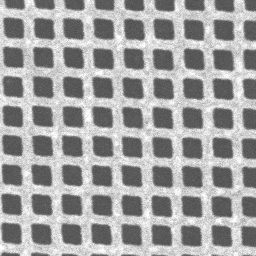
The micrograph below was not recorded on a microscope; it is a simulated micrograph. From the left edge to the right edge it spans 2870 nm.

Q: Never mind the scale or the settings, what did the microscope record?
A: a regular array of holes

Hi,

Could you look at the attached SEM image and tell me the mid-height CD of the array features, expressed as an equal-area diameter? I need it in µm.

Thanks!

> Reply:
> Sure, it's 0.258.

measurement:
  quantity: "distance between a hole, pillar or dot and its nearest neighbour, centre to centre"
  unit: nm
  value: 328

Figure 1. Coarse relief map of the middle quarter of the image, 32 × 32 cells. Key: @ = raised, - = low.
-----@@------@@-----@@-----@@@--
@@@@@@@@@@@@@@@@@@-@@@@----@@@@@
@@@@@@@@@@@@@@@@@@@@@@@@@@@@@@@@
----@@@----@@@@----@@@@---@@@@-@
-----@@-----@@------@@-----@@@--
-----@@-----@@@-----@@-----@@@--
-----@@------@@-----@@------@@--
-----@@-----@@@-----@@------@@--
@----@@@----@@@@----@@@-----@@--
@@@@@@@@@@@@@@@@@@@@@@@@@@@@@@@@
--@@@@@@--@@@@@@@@@@@@@@@@@@@@@@
-----@@-----@@@----@@@-----@@---
-----@@-----@@@-----@@-----@@---
-----@@-----@@@-----@@-----@@@--
-----@@-----@@@-----@@-----@@@--
@----@@@----@@@-----@@-----@@@--
@@@@@@@@@@@@@@@@@@@@@@@@@@@@@@@@
@@@@@@@@@@@@@@@@@@@@@@@@@@@@@@@@
----@@@-----@@-----@@@----@@@@--
-----@@-----@@------@@-----@@---
-----@@-----@@------@@-----@@---
-----@@-----@@------@@-----@@---
-----@@------@@-----@@-----@@---
@@@@@@@@@@@-@@@@@--@@@@----@@@@-
@@@@@@@@@@@@@@@@@@@@@@@@@@@@@@@@
----@@@----@@@----@@@@--@@@@@@-@
-----@@-----@@-----@@@-----@@---
-----@@-----@@-----@@@-----@@---
-----@@-----@@------@@-----@@---
-----@@-----@@@-----@@-----@@@--
@---@@@@----@@@-----@@@----@@@--
@@@@@@@@@@@@@@@@@@@@@@@@@@@@@@@@